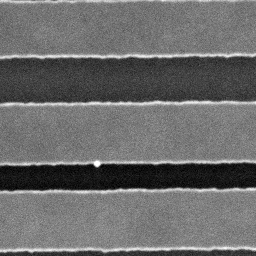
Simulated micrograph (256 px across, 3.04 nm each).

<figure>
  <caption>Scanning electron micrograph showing lines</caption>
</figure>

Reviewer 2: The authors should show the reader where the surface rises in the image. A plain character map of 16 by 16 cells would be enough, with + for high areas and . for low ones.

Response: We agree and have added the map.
++++++++++++++++
++++++++++++++++
++++++++++++++++
++++++++++++++++
................
................
++++++++++++++++
++++++++++++++++
++++++++++++++++
++++++++++++++++
................
................
++++++++++++++++
++++++++++++++++
++++++++++++++++
++++++++++++++++